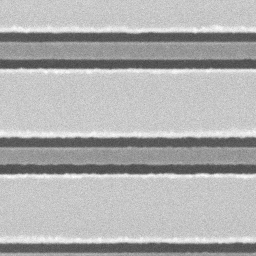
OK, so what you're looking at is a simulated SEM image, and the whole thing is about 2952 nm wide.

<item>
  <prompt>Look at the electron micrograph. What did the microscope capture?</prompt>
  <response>lines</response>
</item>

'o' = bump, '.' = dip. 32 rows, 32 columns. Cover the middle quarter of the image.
................................
oooooooooooooooooooooooooooooooo
oooooooooooooooooooooooooooooooo
oooooooooooooooooooooooooooooooo
oooooooooooooooooooooooooooooooo
oooooooooooooooooooooooooooooooo
oooooooooooooooooooooooooooooooo
oooooooooooooooooooooooooooooooo
oooooooooooooooooooooooooooooooo
oooooooooooooooooooooooooooooooo
oooooooooooooooooooooooooooooooo
oooooooooooooooooooooooooooooooo
oooooooooooooooooooooooooooooooo
oooooooooooooooooooooooooooooooo
oooooooooooooooooooooooooooooooo
oooooooooooooooooooooooooooooooo
oooooooooooooooooooooooooooooooo
oooooooooooooooooooooooooooooooo
................................
................................
................................
oooooooooooooooooooooooooooooooo
oooooooooooooooooooooooooooooooo
oooooooooooooooooooooooooooooooo
oooooooooooooooooooooooooooooooo
................................
................................
................................
oooooooooooooooooooooooooooooooo
oooooooooooooooooooooooooooooooo
oooooooooooooooooooooooooooooooo
oooooooooooooooooooooooooooooooo